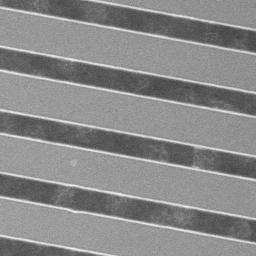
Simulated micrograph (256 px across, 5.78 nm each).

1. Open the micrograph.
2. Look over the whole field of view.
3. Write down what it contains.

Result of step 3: one or a few lines or trenches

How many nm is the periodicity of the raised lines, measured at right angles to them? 359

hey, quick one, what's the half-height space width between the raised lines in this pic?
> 216 nm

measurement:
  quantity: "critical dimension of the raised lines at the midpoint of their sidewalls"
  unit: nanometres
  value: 142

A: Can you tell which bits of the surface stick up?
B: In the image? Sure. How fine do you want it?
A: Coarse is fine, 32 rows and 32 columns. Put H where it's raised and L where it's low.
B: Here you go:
HHHHHHHHHHHHHHHLLLLLLLLLLLLLLLLL
LLLHHHHHHHHHHHHHHHHHLLLLLLLLLLLL
LLLLLLLLHHHHHHHHHHHHHHHHHHLLLLLL
LLLLLLLLLLLLLLHHHHHHHHHHHHHHHHHL
LLLLLLLLLLLLLLLLLLLHHHHHHHHHHHHH
LLLLLLLLLLLLLLLLLLLLLLLLLHHHHHHH
HHHHLLLLLLLLLLLLLLLLLLLLLLLLLLHH
HHHHHHHHHLLLLLLLLLLLLLLLLLLLLLLL
HHHHHHHHHHHHHHHLLLLLLLLLLLLLLLLL
LLLHHHHHHHHHHHHHHHHHHLLLLLLLLLLL
LLLLLLLLLHHHHHHHHHHHHHHHHHLLLLLL
LLLLLLLLLLLLLLHHHHHHHHHHHHHHHHHH
LLLLLLLLLLLLLLLLLLLLHHHHHHHHHHHH
LLLLLLLLLLLLLLLLLLLLLLLLLHHHHHHH
HHHHLLLLLLLLLLLLLLLLLLLLLLLLLLLH
HHHHHHHHHHLLLLLLLLLLLLLLLLLLLLLL
HHHHHHHHHHHHHHHLLLLLLLLLLLLLLLLL
LLLLHHHHHHHHHHHHHHHHHLLLLLLLLLLL
LLLLLLLLLLHHHHHHHHHHHHHHHHLLLLLL
LLLLLLLLLLLLLLLHHHHHHHHHHHHHHHHH
LLLLLLLLLLLLLLLLLLLLLHHHHHHHHHHH
LLLLLLLLLLLLLLLLLLLLLLLLLLHHHHHH
HHHHHLLLLLLLLLLLLLLLLLLLLLLLLLLL
HHHHHHHHHHHLLLLLLLLLLLLLLLLLLLLL
HHHHHHHHHHHHHHLHLLLLLLLLLLLLLLLL
LLLLLHHHHHHHHHHHHHHHHHLLLLLLLLLL
LLLLLLLLLLHHHHHHHHHHHHHLHHHLLLLL
LLLLLLLLLLLLLLLLHHHHHHHHHHHHHHHH
LLLLLLLLLLLLLLLLLLLLLHHHHHHHHHHH
HLLLLLLLLLLLLLLLLLLLLLLLLLLHHHHH
HHHHHHLLLLLLLLLLLLLLLLLLLLLLLLLL
HHHHHHHHHHHHLLLLLLLLLLLLLLLLLLLL